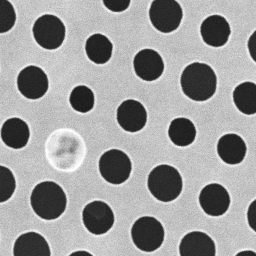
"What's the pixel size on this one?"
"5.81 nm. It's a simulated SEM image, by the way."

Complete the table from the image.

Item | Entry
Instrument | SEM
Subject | a regular array of holes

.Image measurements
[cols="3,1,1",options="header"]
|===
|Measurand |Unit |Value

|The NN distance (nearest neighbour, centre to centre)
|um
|0.304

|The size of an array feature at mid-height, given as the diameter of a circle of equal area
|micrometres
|0.19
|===